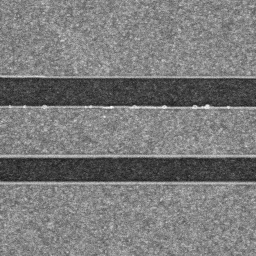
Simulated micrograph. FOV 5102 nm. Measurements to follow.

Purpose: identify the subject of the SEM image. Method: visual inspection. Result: lines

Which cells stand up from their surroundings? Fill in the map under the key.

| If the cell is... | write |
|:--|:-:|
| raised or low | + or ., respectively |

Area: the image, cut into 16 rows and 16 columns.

++++++++++++++++
++++++++++++++++
++++++++++++++++
++++++++++++++++
++++++++++++++++
................
................
++++++++++++++++
++++++++++++++++
++++++++++++++++
................
................
++++++++++++++++
++++++++++++++++
++++++++++++++++
++++++++++++++++